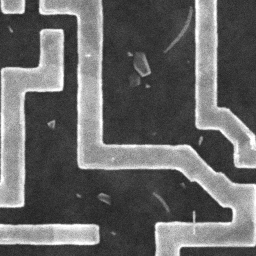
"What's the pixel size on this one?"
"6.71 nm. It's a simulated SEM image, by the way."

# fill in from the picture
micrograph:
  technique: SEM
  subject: wiring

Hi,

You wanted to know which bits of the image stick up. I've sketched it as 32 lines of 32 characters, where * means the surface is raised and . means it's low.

***..*******.............**.....
......*******............**.....
..........***............**.....
..........***............**.....
.....***..***............**.....
.....***..***............**.....
.....***..***............**.....
.....***..**.....*.......**.....
.....***..**.....**.......*.....
********..**.............**.....
********..**.............**.....
***.......**.............**.....
***.......***............**.....
***.......**.............**.....
**........**.............****...
**........***............*****..
***.......***...............*...
***.......***...................
***.......************..........
***.......***************......*
***.......****************....**
***....................****.....
***......................***....
***.......................******
***........................*****
**..........................****
.............................***
.............................***
************........************
************........************
....................***********.
....................**..........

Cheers